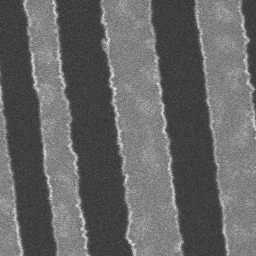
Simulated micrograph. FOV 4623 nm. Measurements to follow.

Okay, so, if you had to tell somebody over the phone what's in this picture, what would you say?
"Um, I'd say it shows one or a few lines or trenches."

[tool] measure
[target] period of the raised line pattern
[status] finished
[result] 1.55 microns